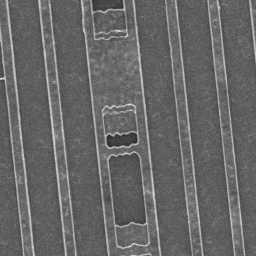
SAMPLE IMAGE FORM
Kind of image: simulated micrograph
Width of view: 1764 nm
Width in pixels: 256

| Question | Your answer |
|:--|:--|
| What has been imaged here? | parallel lines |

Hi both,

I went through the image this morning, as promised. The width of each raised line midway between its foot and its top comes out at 72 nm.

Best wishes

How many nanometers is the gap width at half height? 215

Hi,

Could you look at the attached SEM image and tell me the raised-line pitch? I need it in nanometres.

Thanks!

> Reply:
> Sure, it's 289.